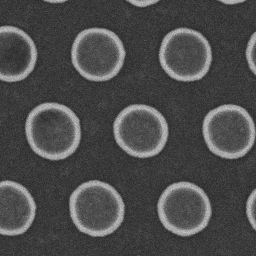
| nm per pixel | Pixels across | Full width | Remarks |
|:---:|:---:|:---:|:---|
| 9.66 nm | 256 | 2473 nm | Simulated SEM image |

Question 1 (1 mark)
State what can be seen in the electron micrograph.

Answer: raised bodies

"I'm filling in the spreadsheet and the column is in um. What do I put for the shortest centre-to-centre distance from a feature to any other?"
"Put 0.849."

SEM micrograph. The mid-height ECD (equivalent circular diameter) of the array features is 482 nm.